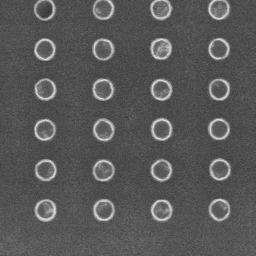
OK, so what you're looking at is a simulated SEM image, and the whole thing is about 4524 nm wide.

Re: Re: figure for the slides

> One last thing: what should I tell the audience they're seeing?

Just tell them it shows a regular array of raised bodies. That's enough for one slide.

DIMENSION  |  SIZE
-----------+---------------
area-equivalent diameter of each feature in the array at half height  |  369 nanometers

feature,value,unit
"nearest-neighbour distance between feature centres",707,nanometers